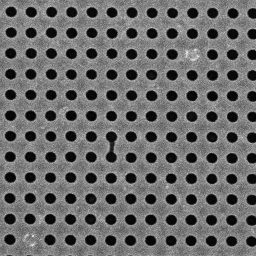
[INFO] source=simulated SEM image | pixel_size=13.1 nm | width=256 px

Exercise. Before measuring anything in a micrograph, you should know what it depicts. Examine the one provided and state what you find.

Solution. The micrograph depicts a regular array of holes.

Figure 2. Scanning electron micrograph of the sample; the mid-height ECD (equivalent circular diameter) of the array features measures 11.3 px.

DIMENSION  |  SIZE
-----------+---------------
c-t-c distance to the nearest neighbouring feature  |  0.261 micrometres